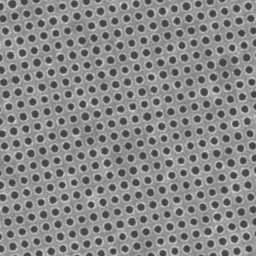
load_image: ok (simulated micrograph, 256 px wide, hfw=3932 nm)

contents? a regular array of holes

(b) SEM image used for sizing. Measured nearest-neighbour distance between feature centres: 185 nm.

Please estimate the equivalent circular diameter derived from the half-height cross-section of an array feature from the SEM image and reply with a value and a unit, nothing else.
123 nm